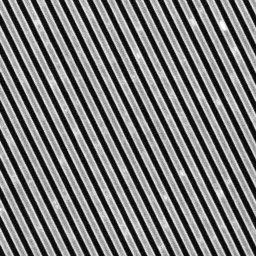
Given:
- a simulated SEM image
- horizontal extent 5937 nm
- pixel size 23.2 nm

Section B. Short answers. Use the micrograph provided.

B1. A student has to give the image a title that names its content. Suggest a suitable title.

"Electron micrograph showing parallel lines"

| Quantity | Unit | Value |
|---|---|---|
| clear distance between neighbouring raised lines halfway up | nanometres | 148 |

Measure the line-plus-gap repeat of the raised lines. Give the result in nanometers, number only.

295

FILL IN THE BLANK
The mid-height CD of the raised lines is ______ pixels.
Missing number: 6.39